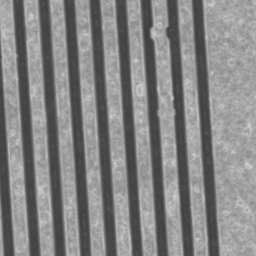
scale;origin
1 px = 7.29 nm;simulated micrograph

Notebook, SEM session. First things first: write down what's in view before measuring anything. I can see parallel lines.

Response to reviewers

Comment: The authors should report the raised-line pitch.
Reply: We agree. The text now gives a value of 186 nm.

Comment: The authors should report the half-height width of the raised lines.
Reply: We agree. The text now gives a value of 15.7 px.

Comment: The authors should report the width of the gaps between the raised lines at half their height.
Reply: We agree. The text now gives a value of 71.8 nm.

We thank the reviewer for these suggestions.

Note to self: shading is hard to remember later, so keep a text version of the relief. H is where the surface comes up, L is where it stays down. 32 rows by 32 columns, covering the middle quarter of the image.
HLLLHHHHLLHHHHLLLHHHLLLHHHHLLHHH
HLLLHHHHLLHHHHLLLHHHLLLHHHHLLHHH
HLLLHHHHLLHHHHLLLHHHLLLHHHHLLLHH
HLLLHHHHLLHHHHLLLHHHHLLHHHHLLLHH
HLLLHHHHLLHHHHLLLHHHHLLHHHHLLLHH
HLLLHHHHLLLHHHLLLHHHHLLHHHHLLLHH
HLLLHHHHLLLHHHLLLHHHHLLHHHHLLLHH
HHLLHHHHLLLHHHLLLHHHHLLHHHHLLLHH
HHLLHHHHLLLHHHLLLHHHHLLLHHHLLLHH
HHLLHHHHLLLHHHHLLHHHHLLLHHHLLLHH
HHLLHHHHLLLHHHHLLHHHHLLLHHHLLLHH
HHLLHHHHLLLHHHHLLHHHHLLLHHHHLLHH
HHLLLHHHLLLHHHHLLHHHHLLLHHHHLLHH
HHLLLHHHLLLHHHHLLHHHHLLLHHHHLLHH
HHLLLHHHLLLHHHHLLLHHHLLLHHHHLLHH
HHLLLHHHLLLHHHHLLLHHHLLLHHHHLLHH
HHLLLHHHHLLHHHHLLLHHHLLLHHHHLLHH
HHLLLHHHHLLHHHHLLLHHHLLLHHHHLLLH
HHLLLHHHHLLHHHHLLLHHHHLLHHHHLLHH
HHLLLHHHHLLHHHHLLLHHHHLLHHHHLLHH
HHLLLHHHHLLHHHHLLLHHHHLLHHHHLLLH
HHLLLHHHHLLLHHHLLLHHHHLLHHHHLLLH
HHHLLHHHHLLLHHHLLLHHHHLLHHHHLLLH
HHHLLHHHHLLLHHHLLLHHHHLLLHHHLLLH
HHHLLHHHHLLLHHHLLLHHHHLLLHHHLLLH
HHHLLHHHHLLLHHHHLLHHHHLLLHHHLLLH
HHHLLHHHHLLLHHHHLLHHHHLLHHHHLLLH
HHHLLLHHHLLLHHHHLLHHHHLLLHHHHLLH
HHHLLLHHHLLLHHHHLLHHHHLLLHHHHLLH
HHHLLLHHHLLLHHHHLLHHHHLLLHHHHLLH
HHHLLLHHHLLLHHHHLLLHHHLLLHHHHLLH
HHHLLLHHHHLLHHHHLLLHHHLLLHHHHLLH